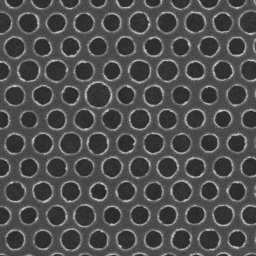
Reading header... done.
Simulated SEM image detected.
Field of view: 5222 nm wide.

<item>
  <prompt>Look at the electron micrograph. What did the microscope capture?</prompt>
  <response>a regular array of holes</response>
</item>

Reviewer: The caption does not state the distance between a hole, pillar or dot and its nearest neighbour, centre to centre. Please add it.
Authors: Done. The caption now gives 0.561 um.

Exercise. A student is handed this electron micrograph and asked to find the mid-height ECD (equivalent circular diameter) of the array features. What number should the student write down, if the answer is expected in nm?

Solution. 375